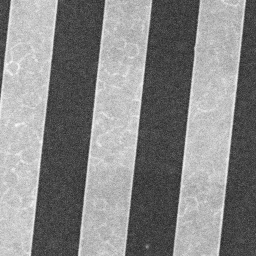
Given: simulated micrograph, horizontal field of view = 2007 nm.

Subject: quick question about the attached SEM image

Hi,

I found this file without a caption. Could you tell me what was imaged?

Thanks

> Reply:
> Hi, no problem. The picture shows one or a few lines or trenches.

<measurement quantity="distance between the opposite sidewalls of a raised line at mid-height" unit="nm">348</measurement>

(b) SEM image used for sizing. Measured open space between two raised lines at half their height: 381 nm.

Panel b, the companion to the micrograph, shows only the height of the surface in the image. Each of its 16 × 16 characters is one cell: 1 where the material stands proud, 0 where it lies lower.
0111000110000110
0110001110001110
1110001110001110
1110001110001110
1110001110001110
1110001110001110
1110001110001110
1110001110001110
1110001110001100
1110001100001100
1100011100011100
1100011100011100
1100011100011100
1100011100011100
1100011100011100
1100011100011100